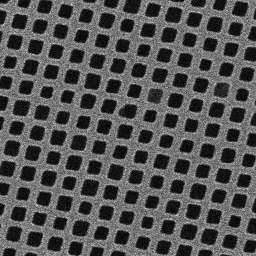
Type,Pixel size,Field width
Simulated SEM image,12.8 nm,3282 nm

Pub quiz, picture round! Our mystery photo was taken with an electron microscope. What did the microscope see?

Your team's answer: a regular array of holes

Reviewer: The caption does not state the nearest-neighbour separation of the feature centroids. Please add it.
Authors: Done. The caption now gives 266 nanometers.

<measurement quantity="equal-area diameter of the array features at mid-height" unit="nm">198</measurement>